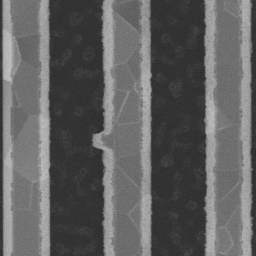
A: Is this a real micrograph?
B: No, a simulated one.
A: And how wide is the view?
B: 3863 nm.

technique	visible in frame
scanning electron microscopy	one or a few lines or trenches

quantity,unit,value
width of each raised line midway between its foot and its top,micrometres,0.541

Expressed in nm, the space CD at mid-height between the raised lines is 989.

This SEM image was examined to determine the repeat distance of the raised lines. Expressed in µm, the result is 1.53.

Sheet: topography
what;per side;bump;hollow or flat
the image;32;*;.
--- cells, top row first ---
.****.........****........*****.
.****.........****........*****.
.****.........****........*****.
.****.........****........*****.
.****.........****........*****.
.****.........****........*****.
.****.........****........*****.
.****.........****........*****.
.****.........****........*****.
.****.........****........*****.
.****.........****........*****.
.****.........****........*****.
.****.........****.........****.
.****.........****........*****.
.****.........****........*****.
.****.........****........*****.
.****........*****........*****.
.****.......******........*****.
.****........*****........*****.
.****.........****........*****.
.****.........****........*****.
.****.........****........*****.
.*****........****........*****.
.*****........****........*****.
.*****........****........*****.
.****.........****........*****.
.*****........****.........****.
.*****........****.........****.
.*****........****........*****.
.*****........****........*****.
.*****........****........*****.
.****.........****........*****.